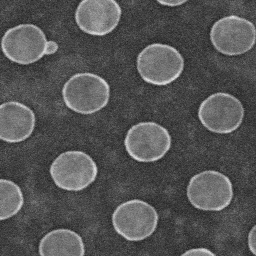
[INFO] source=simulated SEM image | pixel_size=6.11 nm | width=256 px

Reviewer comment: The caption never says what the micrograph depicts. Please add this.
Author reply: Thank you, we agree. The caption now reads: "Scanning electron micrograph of a regular array of raised bodies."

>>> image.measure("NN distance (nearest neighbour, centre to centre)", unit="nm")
480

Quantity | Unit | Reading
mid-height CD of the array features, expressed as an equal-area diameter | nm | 253